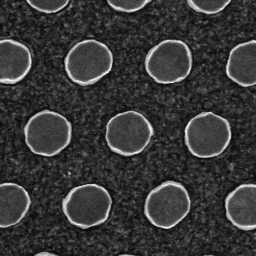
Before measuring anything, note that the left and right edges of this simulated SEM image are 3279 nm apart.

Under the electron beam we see raised bodies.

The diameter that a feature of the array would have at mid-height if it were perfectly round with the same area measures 0.573 µm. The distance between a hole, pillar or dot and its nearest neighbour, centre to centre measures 1.02 micrometres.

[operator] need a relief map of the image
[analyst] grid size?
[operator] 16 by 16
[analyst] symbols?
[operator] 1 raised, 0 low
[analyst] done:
0011000110001100
0000000000000000
0000000000000000
1100111001110011
1100111001110011
0000000000000000
0000000000000000
0011000110001100
0011000110001100
0011000110001100
0000000000000000
1000000000100000
1100111001110011
1000111001110011
0000000000000000
0000000000000000